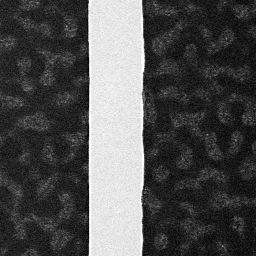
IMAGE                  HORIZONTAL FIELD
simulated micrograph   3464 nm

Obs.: one or a few lines or trenches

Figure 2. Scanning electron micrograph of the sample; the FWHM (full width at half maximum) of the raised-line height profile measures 717 nm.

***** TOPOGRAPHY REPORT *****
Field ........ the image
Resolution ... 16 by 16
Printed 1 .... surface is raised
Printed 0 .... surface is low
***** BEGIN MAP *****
0000001110000000
0000001110000000
0000001110000000
0000001110000000
0000001110000000
0000001110000000
0000001110000000
0000001110000000
0000001110000000
0000001110000000
0000001110000000
0000001110000000
0000001110000000
0000001110000000
0000001110000000
0000001110000000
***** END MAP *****